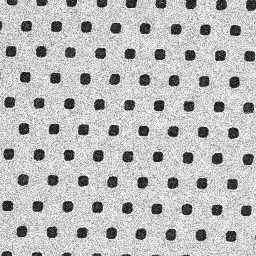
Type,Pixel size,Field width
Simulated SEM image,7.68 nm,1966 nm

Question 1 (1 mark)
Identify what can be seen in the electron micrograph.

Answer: a regular array of holes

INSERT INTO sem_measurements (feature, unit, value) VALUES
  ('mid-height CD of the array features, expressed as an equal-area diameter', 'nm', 92.3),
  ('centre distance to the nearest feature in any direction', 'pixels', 29.2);